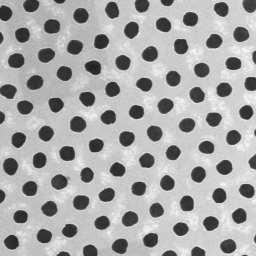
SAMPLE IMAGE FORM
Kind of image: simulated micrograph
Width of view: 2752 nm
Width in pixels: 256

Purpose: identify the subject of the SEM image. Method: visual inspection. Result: a regular array of holes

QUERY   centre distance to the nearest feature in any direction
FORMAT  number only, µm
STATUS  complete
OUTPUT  0.297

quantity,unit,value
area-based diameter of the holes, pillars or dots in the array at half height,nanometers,164